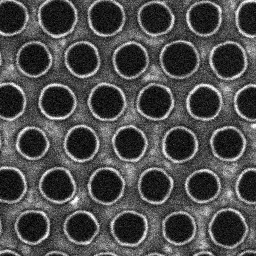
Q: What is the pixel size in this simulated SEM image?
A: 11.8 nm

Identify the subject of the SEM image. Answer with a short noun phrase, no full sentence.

a regular array of raised bodies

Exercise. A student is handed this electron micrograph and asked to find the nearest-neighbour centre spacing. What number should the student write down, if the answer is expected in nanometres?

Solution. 564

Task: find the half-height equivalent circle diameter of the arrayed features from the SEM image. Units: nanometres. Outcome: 413